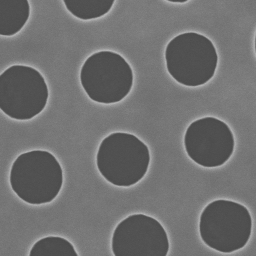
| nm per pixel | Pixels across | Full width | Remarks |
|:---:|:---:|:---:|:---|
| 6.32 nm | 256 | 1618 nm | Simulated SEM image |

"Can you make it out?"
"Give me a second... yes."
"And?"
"holes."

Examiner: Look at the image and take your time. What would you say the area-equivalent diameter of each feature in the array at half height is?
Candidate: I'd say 332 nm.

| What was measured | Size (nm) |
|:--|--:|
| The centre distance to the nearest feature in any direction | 537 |